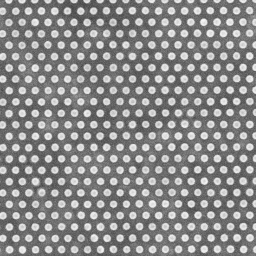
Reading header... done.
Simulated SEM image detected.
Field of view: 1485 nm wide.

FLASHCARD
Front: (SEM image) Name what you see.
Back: a regular array of raised bodies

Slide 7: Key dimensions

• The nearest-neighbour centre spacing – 12.8 pixels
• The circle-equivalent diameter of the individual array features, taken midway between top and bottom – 0.0393 µm